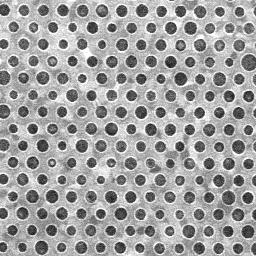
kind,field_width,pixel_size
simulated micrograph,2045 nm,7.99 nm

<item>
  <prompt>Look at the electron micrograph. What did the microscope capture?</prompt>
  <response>a regular array of holes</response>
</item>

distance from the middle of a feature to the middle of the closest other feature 154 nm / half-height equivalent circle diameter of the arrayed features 11.6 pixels